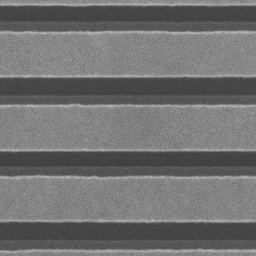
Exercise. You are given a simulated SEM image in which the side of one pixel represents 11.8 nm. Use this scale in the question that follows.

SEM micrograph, lines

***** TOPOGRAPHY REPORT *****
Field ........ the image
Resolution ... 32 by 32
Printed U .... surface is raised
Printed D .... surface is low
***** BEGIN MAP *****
UUUUUUUUUUUUUUUUUUUUUUUUUUUUUUUU
DDDDDDDDDDDDDDDDDDDDDDDDDDDDDDDD
DDDDDDDDDDDDDDDDDDDDDDDDDDDDDDDD
DDDDDDDDDDDDDDDDDDDDDDDDDDDDDDDD
UUUUUUUUUUUUUUUUUUUUUUUUUUUUUUUU
UUUUUUUUUUUUUUUUUUUUUUUUUUUUUUUU
UUUUUUUUUUUUUUUUUUUUUUUUUUUUUUUU
UUUUUUUUUUUUUUUUUUUUUUUUUUUUUUUU
UUUUUUUUUUUUUUUUUUUUUUUUUUUUUUUU
UUUUUUUUUUUUUUUUUUUUUUUUUUUUUUUU
DDDDDDDDDDDDDDDDDDDDDDDDDDDDDDDD
DDDDDDDDDDDDDDDDDDDDDDDDDDDDDDDD
DDDDDDDDDDDDDDDDDDDDDDDDDDDDDDDD
UUUUUUUUUUUUUUUUUUUUUUUUUUUUUUUU
UUUUUUUUUUUUUUUUUUUUUUUUUUUUUUUU
UUUUUUUUUUUUUUUUUUUUUUUUUUUUUUUU
UUUUUUUUUUUUUUUUUUUUUUUUUUUUUUUU
UUUUUUUUUUUUUUUUUUUUUUUUUUUUUUUU
UUUUUUUUUUUUUUUUUUUUUUUUUUUUUUUU
DDDDDDDDDDDDDDDDDDDDDDDDDDDDDDDD
DDDDDDDDDDDDDDDDDDDDDDDDDDDDDDDD
DDDDDDDDDDDDDDDDDDDDDDDDDDDDDDDD
UUUUUUUUUUUUUUUUUUUUUUUUUUUUUUUU
UUUUUUUUUUUUUUUUUUUUUUUUUUUUUUUU
UUUUUUUUUUUUUUUUUUUUUUUUUUUUUUUU
UUUUUUUUUUUUUUUUUUUUUUUUUUUUUUUU
UUUUUUUUUUUUUUUUUUUUUUUUUUUUUUUU
UUUUUUUUUUUUUUUUUUUUUUUUUUUUUUUU
DDDDDDDDDDDDDDDDDDDDDDDDDDDDDDDD
DDDDDDDDDDDDDDDDDDDDDDDDDDDDDDDD
DDDDDDDDDDDDDDDDDDDDDDDDDDDDDDDD
UUUUUUUUUUUUUUUUUUUUUUUUUUUUUUUU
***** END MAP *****